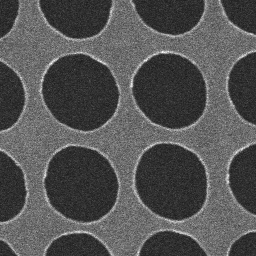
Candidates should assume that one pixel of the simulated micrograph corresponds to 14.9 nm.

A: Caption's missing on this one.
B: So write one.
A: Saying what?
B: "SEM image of holes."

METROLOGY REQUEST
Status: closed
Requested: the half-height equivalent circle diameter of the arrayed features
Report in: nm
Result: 1120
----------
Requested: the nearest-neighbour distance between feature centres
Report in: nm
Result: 1340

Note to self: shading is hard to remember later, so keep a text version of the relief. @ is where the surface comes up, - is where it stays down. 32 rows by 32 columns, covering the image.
--@@@---------@@@---------@@----
--@@@---------@@@--------@@@----
--@@@@--------@@@@-------@@@@---
--@@@@@------@@@@@@-----@@@@@@--
-@@@@@@@----@@@@@@@@@@@@@@@@@@@@
@@@@@@@@@@@@@@@@@@@@@@@@@@@@@@@@
@@@@@@@@@@@@@@@@@@@@@@@@@@@@@@@@
@@@@@@@-----@@@@@@------@@@@@@--
-@@@@@--------@@@--------@@@@---
--@@@@--------@@@--------@@@@---
---@@----------@@---------@@----
---@@----------@@---------@@----
---@@----------@@---------@@@---
---@@@---------@@---------@@@---
--@@@@@-------@@@@-------@@@@@--
--@@@@@@-----@@@@@@-----@@@@@@@-
@@@@@@@@@@@@@@@@@@@@@@@@@@@@@@@@
@@@@@@@@@@@@@@@@@@@@@@@@@@@@@@@@
@@@@@@@@---@@@@@@@@----@@@@@@@@-
-@@@@@@------@@@@@-------@@@@---
--@@@@--------@@@--------@@@@---
---@@@--------@@@---------@@@---
---@@@---------@@---------@@@---
---@@@---------@@---------@@@---
---@@@---------@@---------@@@---
---@@@--------@@@@-------@@@@@--
---@@@@-------@@@@@------@@@@@@-
-@@@@@@@@---@@@@@@@@@--@@@@@@@@@
@@@@@@@@@@@@@@@@@@@@@@@@@@@@@@@@
@@@@@@@@----@@@@@@@-----@@@@@@--
-@@@@@-------@@@@@-------@@@@---
--@@@@--------@@@---------@@@---